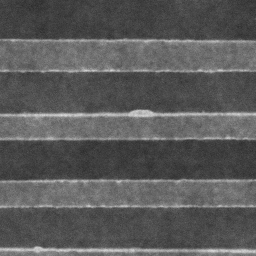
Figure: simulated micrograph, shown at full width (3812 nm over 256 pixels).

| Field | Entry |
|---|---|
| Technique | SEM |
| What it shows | lines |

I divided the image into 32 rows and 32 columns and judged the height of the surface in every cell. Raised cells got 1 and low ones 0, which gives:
00000000000000000000000000000000
00000000000000000000000000000000
00000000000000000000000000000000
00000000000000000000000000000000
00000000000000000000000000000000
11111111111111111111111111111111
11111111111111111111111111111111
11111111111111111111111111111111
11111111111111111111111111111111
00000000000000000000000000000000
00000000000000000000000000000000
00000000000000000000000000000000
00000000000000000000000000000000
00000000000000000000000000000000
00000000001111111111111111111111
11111111111111111111111111111111
11111111111111111111111111111111
00000000000000000000000000000000
00000000000000000000000000000000
00000000000000000000000000000000
00000000000000000000000000000000
00000000000000000000000000000000
00000000000000000000000000000000
11111111111111111111111111111111
11111111111111111111111111111111
11111111111111111111111111111111
00000000000000000000000000000000
00000000000000000000000000000000
00000000000000000000000000000000
00000000000000000000000000000000
00000000000000000000000000000000
11111111111111111111111111111111